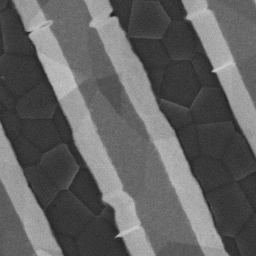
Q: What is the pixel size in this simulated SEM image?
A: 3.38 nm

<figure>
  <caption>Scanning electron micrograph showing one or a few lines or trenches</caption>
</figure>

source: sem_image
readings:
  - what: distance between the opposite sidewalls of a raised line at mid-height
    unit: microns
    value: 0.222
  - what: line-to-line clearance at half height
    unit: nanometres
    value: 293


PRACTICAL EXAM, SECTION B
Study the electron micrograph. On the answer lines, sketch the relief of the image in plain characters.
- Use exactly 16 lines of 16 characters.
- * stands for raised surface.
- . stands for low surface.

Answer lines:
..****......****
..*****......***
...****......***
...*****......**
....****......**
....*****......*
.....****......*
.....*****......
.....*****......
......*****.....
......*****.....
*......*****....
*......*****....
**......****....
**......*****...
***......****...